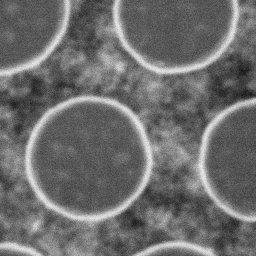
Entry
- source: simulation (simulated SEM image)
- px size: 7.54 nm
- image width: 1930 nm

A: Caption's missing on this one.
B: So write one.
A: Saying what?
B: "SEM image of raised bodies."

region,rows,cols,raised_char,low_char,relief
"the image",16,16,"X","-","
XXXX---XXXXXXXX-
XXXX---XXXXXXXX-
XXXX----XXXXXX--
XXX-----XXXXXX--
X---------------
----------------
----XXX--------X
---XXXXX------XX
--XXXXXXX----XXX
--XXXXXXX----XXX
--XXXXXXX----XXX
--XXXXXXX----XXX
---XXXXX-----XXX
----XX---------X
----------------
X---------XX----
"